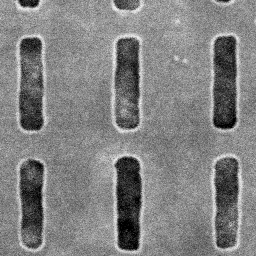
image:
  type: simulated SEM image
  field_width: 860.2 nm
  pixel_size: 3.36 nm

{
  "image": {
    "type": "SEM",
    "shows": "holes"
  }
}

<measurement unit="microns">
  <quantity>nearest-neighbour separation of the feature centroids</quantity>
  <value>0.326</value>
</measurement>